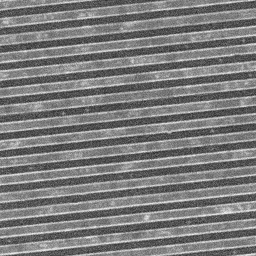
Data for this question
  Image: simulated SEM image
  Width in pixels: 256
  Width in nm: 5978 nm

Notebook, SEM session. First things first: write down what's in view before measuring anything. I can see parallel lines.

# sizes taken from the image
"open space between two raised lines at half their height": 212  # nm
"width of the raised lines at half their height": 192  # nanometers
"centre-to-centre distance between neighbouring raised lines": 0.407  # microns